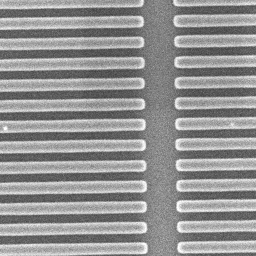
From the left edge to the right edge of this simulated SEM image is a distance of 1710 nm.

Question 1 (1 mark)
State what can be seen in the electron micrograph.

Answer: groups of lines, slits or small figures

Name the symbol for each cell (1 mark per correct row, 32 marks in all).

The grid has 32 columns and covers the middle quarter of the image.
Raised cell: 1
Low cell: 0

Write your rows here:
11111111111111111111000000001111
00000000000000000000000000000000
00000000000000000000000000000000
00000000000000000000000000000111
11111111111111111111000000001111
11111111111111111111000000001111
00000000000000000000000000000000
00000000000000000000000000000000
00000000000000000000000000001111
11111111111111111111000000001111
11111111111111111111000000001111
11111111111111100000000000000000
00000000000000000000000000000000
00000000000000000000000000000000
11111111111111111111000000001111
11111111111111111111000000001111
11111111111111100000000000000000
00000000000000000000000000000000
00000000000000000000000000000000
11111111111111111111000000001111
11111111111111111111000000001111
11111111111111111111000000000111
00000000000000000000000000000000
00000000000000000000000000000000
11111111111111111111000000001111
11111111111111111111000000001111
11111111111111111111000000000111
00000000000000000000000000000000
00000000000000000000000000000000
00000001111111111111000000001111
11111111111111111111000000001111
11111111111111111111000000001111